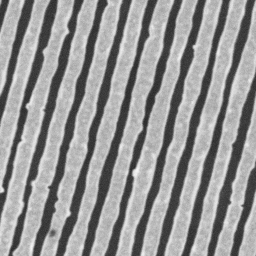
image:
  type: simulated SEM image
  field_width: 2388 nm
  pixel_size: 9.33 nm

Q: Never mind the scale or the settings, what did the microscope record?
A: parallel lines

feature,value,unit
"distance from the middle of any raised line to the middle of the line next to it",224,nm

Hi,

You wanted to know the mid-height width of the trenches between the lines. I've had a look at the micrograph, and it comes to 9.3 pixels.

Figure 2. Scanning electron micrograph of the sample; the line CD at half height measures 133 nanometres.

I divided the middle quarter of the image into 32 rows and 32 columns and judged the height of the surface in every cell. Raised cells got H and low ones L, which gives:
LHHHHLLHHHHLLHHHHLLHHHHLLLHHHLLL
LHHHLLHHHHLLLHHHHLHHHHHLLHHHHLLH
HHHHLLHHHHLLHHHHLLHHHHHLLHHHHLLH
HHHLLLHHHHLLHHHHLLHHHHLLLHHHHLHH
HHHLLLHHHLLLHHHHLLHHHHLLHHHHLLHH
HHHLLLHHHLLLHHHLLLHHHHLLHHHHLLHH
HHHLLHHHHLLLHHHLLHHHHHLLHHHLLLHH
HHHLLHHHLLLLHHHLLHHHHLLHHHHLLLHH
HHLLLHHHLLLHHHHLLHHHHLLHHHHLLLHH
HHLLLHHHLLLHHHLLLHHHLLLHHHLLLLHH
HHLLHHHHLLHHHHLLHHHHLLHHHHLLLHHH
HLLLHHHHLLHHHHLLHHHHLLHHHHLLLHHH
HLLHHHHHLLHHHHLLHHHHLLHHHHLLHHHH
HLLHHHHLLLHHHHLLHHHHLHHHHHLLHHHL
LLLHHHHLLHHHHLLLHHHLLHHHHLLLHHHL
LLLHHHLLLHHHHLLLHHHHLHHHHLLLHHHL
LLLHHHLLLHHHHLLHHHHLLHHHHLLLHHHL
LLLHHHLLHHHHLLLHHHLLLHHHHLLHHHHL
LLHHHHLLHHHHLLLHHHLLHHHHHLLHHHHL
LLHHHHLLHHHHLLHHHHLLHHHHHLLHHHLL
LLHHHHLLHHHHLLHHHLLLHHHHLLHHHHLL
LHHHHHLLHHHLLLHHHLLLHHHHLLHHHHLL
LHHHHHLHHHHLLLHHHLLHHHHHLLHHHLLL
LHHHHLLHHHHLLHHHHLLHHHHLLLHHHLLL
LHHHHLLHHHLLLHHHHLLHHHHLLLHHHLLH
HHHHLLLHHHLLLHHHLLHHHHHLLHHHLLLH
HHHHLLHHHHLLHHHHLLHHHHLLLHHHLLLH
HHHHLLHHHLLLHHHHLHHHHHLLLHHHLLLH
HHHLLLHHHLLLHHHHLLHHHHLLLHHHLLLH
HHHLLLHHHLLLHHHLLLHHHHLLHHHLLLHH
HHHLLLHHHLLLHHHLLHHHHLLLHHHLLLHH
HHHLLHHHLLLHHHHLLHHHHLLLHHHLLLHH